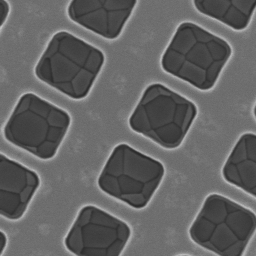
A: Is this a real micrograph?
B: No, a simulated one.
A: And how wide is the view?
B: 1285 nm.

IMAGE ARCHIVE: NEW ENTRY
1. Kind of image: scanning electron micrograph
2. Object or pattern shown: holes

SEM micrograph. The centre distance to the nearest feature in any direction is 344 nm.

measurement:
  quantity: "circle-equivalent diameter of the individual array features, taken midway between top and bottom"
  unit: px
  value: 59.7